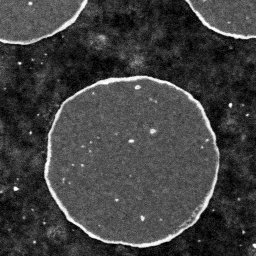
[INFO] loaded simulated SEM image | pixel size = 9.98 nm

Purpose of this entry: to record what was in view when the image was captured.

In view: raised bodies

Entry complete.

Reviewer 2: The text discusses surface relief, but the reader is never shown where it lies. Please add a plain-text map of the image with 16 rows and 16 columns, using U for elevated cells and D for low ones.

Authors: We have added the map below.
UUUUUDDDDDDDUUUU
UUUUDDDDDDDDDUUU
UUDDDDDDDDDDDDDD
DDDDDDDDDDDDDDDD
DDDDDDDDDDDDDDDD
DDDDDUUUUUUDDDDD
DDDDUUUUUUUUDDDD
DDDUUUUUUUUUUDDD
DDDUUUUUUUUUUDDD
DDDUUUUUUUUUUUDD
DDDUUUUUUUUUUUDD
DDDUUUUUUUUUUDDD
DDDDUUUUUUUUUDDD
DDDDUUUUUUUUDDDD
DDDDDUUUUUUDDDDD
DDDDDDDDDDDDDDDD